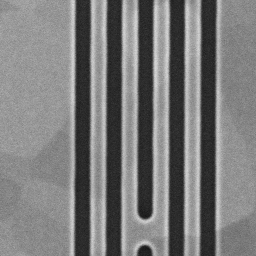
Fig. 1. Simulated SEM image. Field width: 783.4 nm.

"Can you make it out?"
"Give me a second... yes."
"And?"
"groups of lines, slits or small figures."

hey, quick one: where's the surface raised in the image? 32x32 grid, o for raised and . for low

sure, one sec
ooooooooo...o...o..oo..oo..ooooo
ooooooooo...o...o..oo..oo..ooooo
ooooooooo...o..oo..oo..oo..ooooo
ooooooooo...o..oo..oo..oo..ooooo
ooooooooo...o..oo..oo..oo..ooooo
ooooooooo...o..oo..oo..oo..ooooo
ooooooooo...o..oo..oo..oo..ooooo
ooooooooo...o..oo..oo..oo..ooooo
ooooooooo...o..oo..oo..oo..ooooo
ooooooooo...o..oo..oo..oo..ooooo
ooooooooo...o..oo..oo..oo..ooooo
ooooooooo...o..oo..oo..oo..ooooo
ooooooooo...o..oo..oo..oo..ooooo
ooooooooo...o..oo..oo..oo..ooooo
ooooooooo...o..oo..oo..oo..ooooo
ooooooooo...o..oo..oo..oo..ooooo
ooooooooo...o..oo..oo..oo..ooooo
ooooooooo..oo..oo..oo..oo..ooooo
ooooooooo..oo..oo..oo..oo..ooooo
ooooooooo..oo..oo..oo..oo..ooooo
ooooooooo..oo..oo..oo..oo..ooooo
ooooooooo..oo..oo..oo..oo..ooooo
ooooooooo..oo..oo..oo..oo..ooooo
ooooooooo..oo..oo..oo..oo..ooooo
ooooooooo..oo..oo..oo..oo..ooooo
ooooooooo..oo..oo..oo..oo..ooooo
ooooooooo..oo..oo..oo..oo..ooooo
ooooooooo..oo..oooooo..oo..ooooo
ooooooooo..oo..oooooo..oo..ooooo
ooooooooo...o..oooooo..oo..ooooo
ooooooooo..oo..oooooo..oo..ooooo
ooooooooo..oo..oo..oo..oo..ooooo